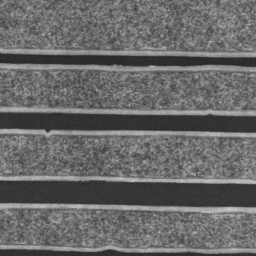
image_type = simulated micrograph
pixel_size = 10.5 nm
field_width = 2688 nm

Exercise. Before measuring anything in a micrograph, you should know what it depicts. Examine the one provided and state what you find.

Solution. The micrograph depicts one or a few lines or trenches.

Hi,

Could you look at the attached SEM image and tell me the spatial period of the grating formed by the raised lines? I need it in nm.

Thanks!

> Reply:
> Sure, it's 729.